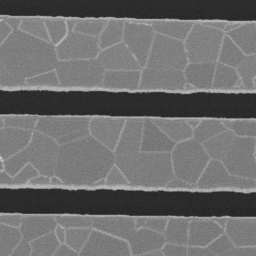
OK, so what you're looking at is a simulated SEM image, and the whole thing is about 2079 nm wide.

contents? lines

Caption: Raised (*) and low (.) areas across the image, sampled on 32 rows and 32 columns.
................................
................................
**********************..........
********************************
********************************
********************************
********************************
********************************
********************************
********************************
********************************
......................**........
................................
................................
****............................
********************************
********************************
********************************
********************************
********************************
********************************
********************************
********************************
...........*....****************
................................
................................
................................
********************************
********************************
********************************
********************************
********************************